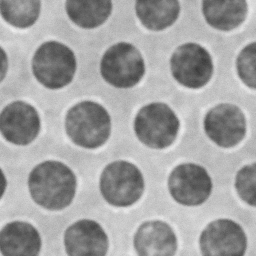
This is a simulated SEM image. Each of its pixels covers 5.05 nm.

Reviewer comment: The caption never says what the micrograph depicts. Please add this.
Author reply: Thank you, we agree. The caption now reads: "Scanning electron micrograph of a regular array of holes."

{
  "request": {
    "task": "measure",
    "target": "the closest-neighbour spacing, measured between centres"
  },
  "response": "0.344 micrometres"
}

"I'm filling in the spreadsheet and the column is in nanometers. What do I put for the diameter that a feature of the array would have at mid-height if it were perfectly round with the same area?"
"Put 243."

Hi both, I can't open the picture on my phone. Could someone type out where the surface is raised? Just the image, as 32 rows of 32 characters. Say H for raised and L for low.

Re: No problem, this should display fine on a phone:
LLLLLHHHLLLLLLHHHLLLLLLHHLLLLLLH
LLLLLHHHLLLLLLHHHLLLLLLHHLLLLLLH
LLLLLHHHHLLLLHHHHLLLLLHHHLLLLLLH
HHLLHHHHHHLLHHHHHHLLLHHHHHLLLLHH
HHHHHHHHHHHHHHHHHHHHHHHHHHHHHHHH
HHHHHLLLHHHHHHLLLHHHHHHLLHHHHHHL
LHHHLLLLLHHHHLLLLLHHHHLLLLHHHHLL
LHHHLLLLLLHHLLLLLLHHHLLLLLLHHLLL
LHHHLLLLLLHHLLLLLLHHHLLLLLLHHLLL
LHHHLLLLLHHHHLLLLLHHHLLLLLLHHHLL
HHHHHLLLLHHHHLLLLHHHHHLLLLHHHHHL
HHHHHHHHHHHHHHHHHHHHHHHHHHHHHHHH
HHLHHHHHHHHHHHHHHHHHHHHHHHHHHHHH
LLLLHHHHHLLLLHHHHLLLLLHHHHLLLLHH
LLLLLHHHLLLLLLHHHLLLLLHHHLLLLLLH
LLLLLHHHLLLLLLHHHLLLLLLHHLLLLLLH
LLLLLHHHLLLLLLHHHLLLLLHHHLLLLLLH
HLLLHHHHHLLLLLHHHLLLLLHHHHLLLLHH
HHHHHHHHHHLLHHHHHHLLLHHHHHHHLHHH
HHHHHHHHHHHHHHHHHHHHHHHHHHHHHHHH
HHHHHLLLHHHHHLLLLHHHHHLLLHHHHHHL
LHHHLLLLLHHHHLLLLLHHHLLLLLHHHLLL
LHHLLLLLLLHHLLLLLLHHHLLLLLHHHLLL
LHHLLLLLLLHHLLLLLLHHHLLLLLLHHLLL
LHHHLLLLLHHHHLLLLLHHHLLLLLHHHHLL
HHHHLLLLLHHHHHLLLHHHHHLLLHHHHHLL
HHHHHHLHHHHHHHHHHHHHHHHHHHHHHHHH
HHLHHHHHHHLLHHHHHHLLHHHHHHLLLHHH
LLLLLHHHLLLLLHHHHLLLLLHHHLLLLLLH
LLLLLHHHLLLLLHHHHLLLLLHHHLLLLLLH
LLLLLHHHLLLLLLHHHLLLLLHHHLLLLLLH
LLLLLHHHLLLLLLHHHLLLLLHHHLLLLLLH